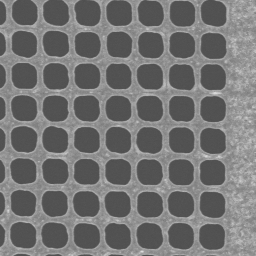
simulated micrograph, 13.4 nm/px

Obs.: a regular array of holes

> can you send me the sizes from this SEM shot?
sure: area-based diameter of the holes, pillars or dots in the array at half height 27.5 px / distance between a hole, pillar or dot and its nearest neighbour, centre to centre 421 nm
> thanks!